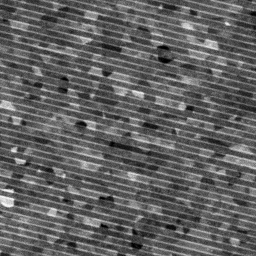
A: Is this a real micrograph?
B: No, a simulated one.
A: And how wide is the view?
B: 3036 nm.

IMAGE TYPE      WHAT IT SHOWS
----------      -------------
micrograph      parallel lines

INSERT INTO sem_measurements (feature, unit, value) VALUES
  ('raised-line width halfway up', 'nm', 79.3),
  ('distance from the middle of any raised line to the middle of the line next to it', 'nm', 158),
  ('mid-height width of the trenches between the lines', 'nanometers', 80.7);